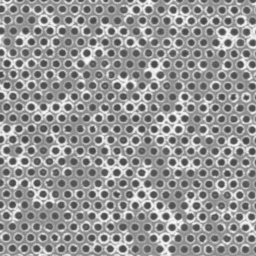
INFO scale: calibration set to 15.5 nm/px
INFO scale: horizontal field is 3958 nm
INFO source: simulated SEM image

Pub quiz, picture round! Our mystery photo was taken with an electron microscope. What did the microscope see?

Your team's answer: a regular array of holes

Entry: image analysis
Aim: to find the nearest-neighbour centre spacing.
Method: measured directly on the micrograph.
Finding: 187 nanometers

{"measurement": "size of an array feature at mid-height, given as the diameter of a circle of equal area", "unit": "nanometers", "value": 122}